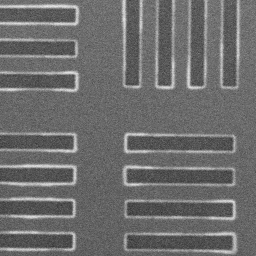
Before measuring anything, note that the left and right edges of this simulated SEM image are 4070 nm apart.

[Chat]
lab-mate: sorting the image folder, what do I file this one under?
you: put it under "groups of lines, slits or small figures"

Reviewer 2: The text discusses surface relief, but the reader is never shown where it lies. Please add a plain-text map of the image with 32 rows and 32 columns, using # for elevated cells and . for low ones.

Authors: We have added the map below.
###############...##..##..##..##
..........#####...##..##..##..##
..........######..##..##..##..##
################..##..##..##..##
################..##..##..##..##
.........#######..##..##..##..##
..........######..##..##..##..##
################..##..##..##..##
################..##..##..##..##
..........######..##..##..##..##
..........######.###..##.###..##
################################
################################
################################
################################
################################
################################
.........#######.............###
.........#######.............###
################################
################################
.........#######.............###
.........#######.............###
################################
################################
.........#######.............###
.........#######.............###
################################
################################
.........#######.............###
.........#######.............###
################################